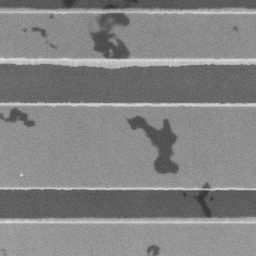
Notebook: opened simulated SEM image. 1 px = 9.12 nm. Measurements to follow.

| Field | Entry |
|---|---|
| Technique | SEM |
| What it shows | lines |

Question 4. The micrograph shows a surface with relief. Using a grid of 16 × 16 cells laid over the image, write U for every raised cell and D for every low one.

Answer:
DDDDDDDDDDDDDDDD
UUUUUUUUUUUUUUUU
UUUUUUUUUUUUUUUU
UUUUUUUUUUUUUUUU
DDDDDDDDDDDDDDDD
DDDDDDDDDDDDDDDD
DDDDDDDDDDDDDDDD
UUUUUUUUUUUUUUUU
UUUUUUUUUUUUUUUU
UUUUUUUUUUUUUUUU
UUUUUUUUUUUUUUUU
UUUUUUUUUUUUUUUU
DDDDDDDDDDDDDDDD
DDDDDDDDDDDDDDDD
UUUUUUUUUUUUUUUU
UUUUUUUUUUUUUUUU